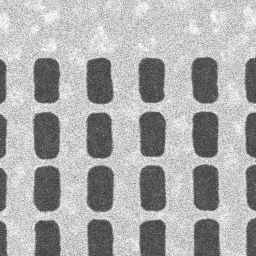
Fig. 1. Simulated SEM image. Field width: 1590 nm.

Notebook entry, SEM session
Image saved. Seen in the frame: a regular array of holes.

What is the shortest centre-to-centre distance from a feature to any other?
328 nanometres